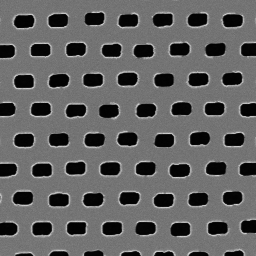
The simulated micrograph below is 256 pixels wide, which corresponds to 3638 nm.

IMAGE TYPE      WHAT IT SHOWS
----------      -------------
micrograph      a regular array of holes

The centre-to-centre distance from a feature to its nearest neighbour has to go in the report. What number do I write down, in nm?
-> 477